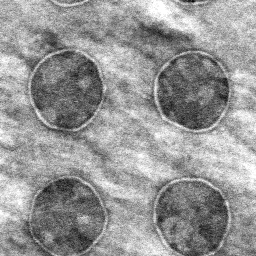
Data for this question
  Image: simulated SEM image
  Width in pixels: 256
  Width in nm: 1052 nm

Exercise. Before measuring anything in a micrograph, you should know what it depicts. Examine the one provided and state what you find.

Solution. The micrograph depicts raised bodies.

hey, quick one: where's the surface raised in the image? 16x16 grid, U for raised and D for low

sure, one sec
DDDDDDDDDDDDDDDD
DDDDDDDDDDDDDDDD
DDDDDDDDDDDDDDDD
DDDUUUDDDDDUUDDD
DDUUUUDDDDUUUUDD
DDUUUUUDDDUUUUDD
DDUUUUDDDDUUUUDD
DDDUUUDDDDDUUUDD
DDDDDDDDDDDDDDDD
DDDDDDDDDDDDDDDD
DDDDDDDDDDDDDDDD
DDDUUDDDDDDUUDDD
DDUUUUDDDDUUUUDD
DDUUUUUDDDUUUUDD
DDUUUUDDDDUUUUDD
DDDUUUDDDDDUUUDD